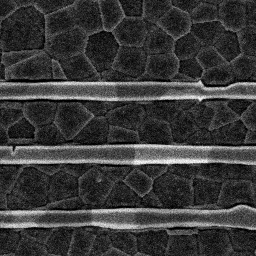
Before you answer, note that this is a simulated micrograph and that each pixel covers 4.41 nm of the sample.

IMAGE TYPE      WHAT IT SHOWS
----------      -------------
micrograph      one or a few lines or trenches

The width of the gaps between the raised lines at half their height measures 0.213 microns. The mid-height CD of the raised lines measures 70.1 nm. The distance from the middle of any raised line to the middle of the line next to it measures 0.282 um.